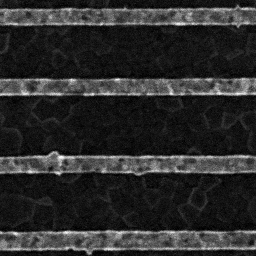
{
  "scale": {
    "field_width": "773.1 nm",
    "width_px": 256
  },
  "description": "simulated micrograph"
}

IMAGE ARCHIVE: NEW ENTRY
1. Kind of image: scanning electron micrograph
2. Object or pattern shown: one or a few lines or trenches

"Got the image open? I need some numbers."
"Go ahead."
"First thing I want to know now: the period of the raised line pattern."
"225 nm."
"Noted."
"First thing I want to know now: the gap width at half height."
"0.182 micrometres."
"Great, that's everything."